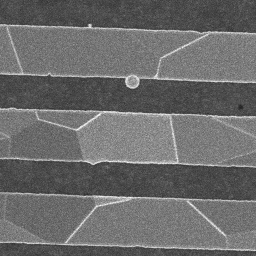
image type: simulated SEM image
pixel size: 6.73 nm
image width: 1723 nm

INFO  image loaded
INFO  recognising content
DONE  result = one or a few lines or trenches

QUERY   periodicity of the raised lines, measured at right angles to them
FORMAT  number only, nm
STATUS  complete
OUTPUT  564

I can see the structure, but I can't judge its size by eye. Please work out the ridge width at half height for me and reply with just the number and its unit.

0.331 um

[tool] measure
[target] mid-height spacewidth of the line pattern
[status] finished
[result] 34.6 px